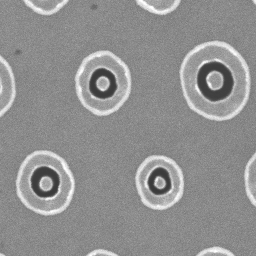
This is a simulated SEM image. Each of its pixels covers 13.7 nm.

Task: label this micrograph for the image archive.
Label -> ring-shaped raised bodies with a dot in the middle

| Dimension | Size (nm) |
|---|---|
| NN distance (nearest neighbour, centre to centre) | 1550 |